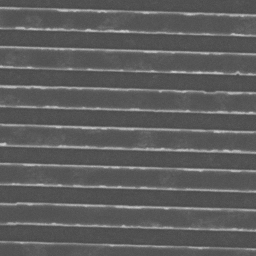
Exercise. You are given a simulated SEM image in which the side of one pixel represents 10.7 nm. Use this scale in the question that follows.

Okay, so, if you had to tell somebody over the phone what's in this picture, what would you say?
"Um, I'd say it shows parallel lines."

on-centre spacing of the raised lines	416	nm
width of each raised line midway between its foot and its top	232	nanometres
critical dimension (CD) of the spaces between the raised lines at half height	0.188	µm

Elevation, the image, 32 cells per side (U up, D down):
DDDDDDDDDDDDDDDDDDDDDDDDDDDDDDDD
UUUUUUUUUUUUUUUUUUUDDDDDDDDDDDDD
UUUUUUUUUUUUUUUUUUUUUUUUUUUUUUUU
UUUUUUUUUUUUUUUUUUUUUUUUUUUUUUUU
DDDDDDDDDDDDDDDDDDDDDDDDDDDDDDDD
DDDDDDDDDDDDDDDDDDDDDDDDDDDDDDDD
UUUUUUUUUUUUUUUUUUUUUDDDDDDDDDDD
UUUUUUUUUUUUUUUUUUUUUUUUUUUUUUUU
DDDUUUUUUUUUUUUUUUUUUUUUUUUUUUUU
DDDDDDDDDDDDDDDDDDDDDDDDDDDDDDDD
DDDDDDDDDDDDDDDDDDDDDDDDDDDDDDDD
UUUUUUUUUUUUUUUUUUUUUUUUUUDDDDDD
UUUUUUUUUUUUUUUUUUUUUUUUUUUUUUUU
DDDDDDUUUUUUUUUUUUUUUUUUUUUUUUUU
DDDDDDDDDDDDDDDDDDDDDDDDDDDDDDDD
DDDDDDDDDDDDDDDDDDDDDDDDDDDDDDDD
UUUUUUUUUUUUUUUUUUUUUUUUUUUUUDDU
UUUUUUUUUUUUUUUUUUUUUUUUUUUUUUUU
DDDDDDDDDDDUUUUUUUUUUUUUUUUUUUUU
DDDDDDDDDDDDDDDDDDDDDDDDDDDDDDDD
UDDDDDDDDDDDDDDDDDDDDDDDDDDDDDDD
UUUUUUUUUUUUUUUUUUUUUUUUUUUUUUUU
UUUUUUUUUUUUUUUUUUUUUUUUUUUUUUUU
DDDDDDDDDDDDDDDDDUUUUUUUUUUUUUUU
DDDDDDDDDDDDDDDDDDDDDDDDDDDDDDDD
UUUUUUUDDDDDDDDDDDDDDDDDDDDDDDDD
UUUUUUUUUUUUUUUUUUUUUUUUUUUUUUUU
UUUUUUUUUUUUUUUUUUUUUUUUUUUUUUUU
DDDDDDDDDDDDDDDDDDDDUUUUUUUUUUUU
DDDDDDDDDDDDDDDDDDDDDDDDDDDDDDDD
UUUUUUUUUUDDDDDDDDDDDDDDDDDDDDDD
UUUUUUUUUUUUUUUUUUUUUUUUUUUUUUUU